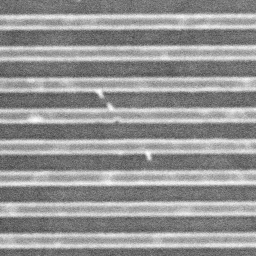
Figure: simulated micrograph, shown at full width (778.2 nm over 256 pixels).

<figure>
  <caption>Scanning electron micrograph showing parallel lines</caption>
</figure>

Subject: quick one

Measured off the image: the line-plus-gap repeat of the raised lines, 95 nanometers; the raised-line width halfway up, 0.038 µm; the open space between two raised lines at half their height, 58.2 nm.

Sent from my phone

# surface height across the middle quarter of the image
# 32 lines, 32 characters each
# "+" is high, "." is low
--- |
................................
................................
................................
................................
++++++++++++++++++++++++++++++++
++++++++++++++++++++++++++++++++
++++++++++++++++++.........+++++
................................
................................
................................
................................
...........++...++++++++++++++++
++++++++++++++++++++++++++++++++
++++++++++++++++++++++++++++++++
................................
................................
................................
................................
................................
++++++++++++++++++++++++++++++++
++++++++++++++++++++++++++++++++
++++++++++++++++++++++++++++++++
................................
................................
................................
................................
................................
++++++++++++++++++++++++++++++++
++++++++++++++++++++++++++++++++
++++++++++++++++++++++++++++++++
................................
................................